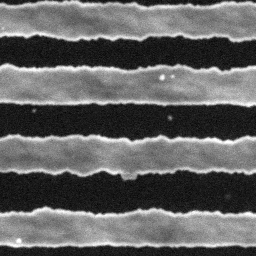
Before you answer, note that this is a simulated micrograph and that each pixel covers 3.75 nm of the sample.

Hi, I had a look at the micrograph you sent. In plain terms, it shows lines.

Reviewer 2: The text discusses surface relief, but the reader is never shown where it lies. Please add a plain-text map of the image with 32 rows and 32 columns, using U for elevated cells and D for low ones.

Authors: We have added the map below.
UDDUUUUUUUUUUUUUUDDDDDDDDDDUUUUU
UUUUUUUUUUUUUUUUUUUUUUUUUUUUUUUU
UUUUUUUUUUUUUUUUUUUUUUUUUUUUUUUU
UUUUUUUUUUUUUUUUUUUUUUUUUUUUUUUU
DDDUDDUUUUUUUUUUUUUUUUDUUUUUUUUU
DDDDDDDDDDDDDDDDDDDDDDDDDDDDDDDD
DDDDDDDDDDDDDDDDDDDDDDDDDDDDDDDD
DDDDDDDDDDDDDDDDDDDDDDDDDDDDDDDD
UUUDDDDUUUUUUUUDDDUUUUUUDDUDDDDU
UUUUUUUUUUUUUUUUUUUUUUUUUUUUUUUU
UUUUUUUUUUUUUUUUUUUUUUUUUUUUUUUU
UUUUUUUUUUUUUUUUUUUUUUUUUUUUUUUU
UUUUUUUUUUUUUUUUUUUUUUUUUUUUUUUU
DDDDDDDDDDDDDDDDDDDDDDDDDDDDDDDD
DDDDDDDDDDDDDDDDDDDDDDDDDDDDDDDD
DDDDDDDDDDDDDDDDDDDDDDDDDDDDDDDD
DDDDDDDDDDDDDDDDDDDDDDDDDDDDDDDD
UUUUUUUUUUUUUUUUDDUUUUUUUUUDDDUU
UUUUUUUUUUUUUUUUUUUUUUUUUUUUUUUU
UUUUUUUUUUUUUUUUUUUUUUUUUUUUUUUU
UUUUUUUUUUUUUUUUUUUUUUUUUUUUUUUU
UDUUUUUUUUUUDUUUUUUUUUDDUUDDUUUU
DDDDDDDDDDDDDDDDDDDDDDDDDDDDDDDD
DDDDDDDDDDDDDDDDDDDDDDDDDDDDDDDD
DDDDDDDDDDDDDDDDDDDDDDDDDDDDDDDD
DDDDDDDDDDDDDDDDDDDDDDDDDDDDDDDD
DUDDUUUUUUUDDDDDUUUUUDDDUUUDDDDD
UUUUUUUUUUUUUUUUUUUUUUUUUUUUUUUU
UUUUUUUUUUUUUUUUUUUUUUUUUUUUUUUU
UUUUUUUUUUUUUUUUUUUUUUUUUUUUUUUU
UUUUUUUUUUUUUUUUUUUUUUUUUUUUUUUU
DDDDDDDDDDDDDDDDDDDDDDDDDDDDDDDD